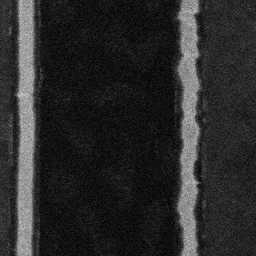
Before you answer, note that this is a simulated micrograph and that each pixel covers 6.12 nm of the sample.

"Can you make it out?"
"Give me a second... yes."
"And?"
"one or a few lines or trenches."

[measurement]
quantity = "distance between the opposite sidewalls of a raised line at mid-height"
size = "1000 nm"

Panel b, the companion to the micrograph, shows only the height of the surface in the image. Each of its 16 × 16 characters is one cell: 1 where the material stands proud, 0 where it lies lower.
0011111111110000
0011111111110000
0011111111110000
0011111111110000
0011111111110000
0011111111110000
0011111111110000
0011111111110000
0011111111110000
0011111111110000
0011111111110000
0011111111110000
0011111111110000
0011111111110000
0011111111110000
0111111111110000